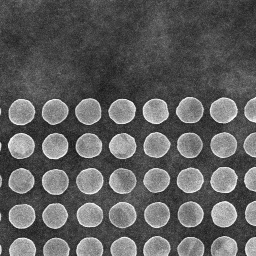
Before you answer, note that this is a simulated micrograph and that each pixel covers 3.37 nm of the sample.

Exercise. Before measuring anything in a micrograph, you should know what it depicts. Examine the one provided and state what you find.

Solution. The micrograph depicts a regular array of raised bodies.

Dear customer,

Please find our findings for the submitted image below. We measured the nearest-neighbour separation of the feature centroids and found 113 nanometres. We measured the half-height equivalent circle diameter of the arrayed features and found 0.0862 microns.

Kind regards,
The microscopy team